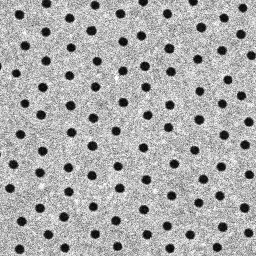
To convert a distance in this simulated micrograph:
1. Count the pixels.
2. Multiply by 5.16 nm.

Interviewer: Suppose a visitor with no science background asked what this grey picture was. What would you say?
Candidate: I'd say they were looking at a regular array of holes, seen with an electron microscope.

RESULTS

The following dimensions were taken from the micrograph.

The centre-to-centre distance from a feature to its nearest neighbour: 126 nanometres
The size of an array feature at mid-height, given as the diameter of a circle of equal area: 48.7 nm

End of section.